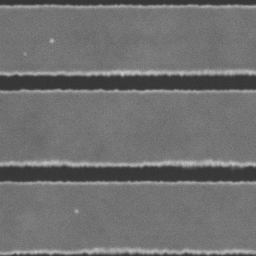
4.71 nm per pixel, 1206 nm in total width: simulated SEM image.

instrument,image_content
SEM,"lines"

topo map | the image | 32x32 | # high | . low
................................
################################
################################
################################
################################
################################
################################
################################
################################
................................
................................
################################
################################
################################
################################
################################
################################
################################
################################
################################
################################
................................
................................
################################
################################
################################
################################
################################
################################
################################
################################
################################